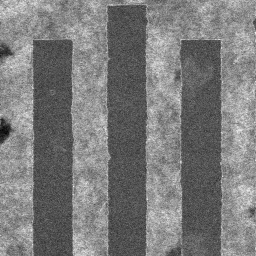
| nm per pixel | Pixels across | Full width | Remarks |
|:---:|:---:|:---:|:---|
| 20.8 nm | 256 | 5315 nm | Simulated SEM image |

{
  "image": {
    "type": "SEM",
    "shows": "one or a few lines or trenches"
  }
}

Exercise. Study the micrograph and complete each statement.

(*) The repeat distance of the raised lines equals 1540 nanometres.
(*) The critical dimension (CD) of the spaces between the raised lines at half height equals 703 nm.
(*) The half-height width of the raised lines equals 836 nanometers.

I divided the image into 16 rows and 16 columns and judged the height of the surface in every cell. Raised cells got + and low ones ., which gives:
.......++.......
.......++.......
..++...++...+...
..+++..++..+++..
..+++..++..+++..
..+++..++..+++..
..+++..++..+++..
..+++..++..+++..
..+++..++..+++..
..+++..++..+++..
..+++..++..+++..
..+++..++..+++..
..+++..++..+++..
..+++..++..+++..
..+++..++..+++..
..+++..++..+++..